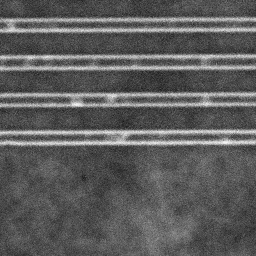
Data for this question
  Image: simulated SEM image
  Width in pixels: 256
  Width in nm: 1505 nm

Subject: parallel lines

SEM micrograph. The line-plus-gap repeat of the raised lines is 221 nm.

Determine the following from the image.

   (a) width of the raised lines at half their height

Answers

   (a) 71.3 nanometers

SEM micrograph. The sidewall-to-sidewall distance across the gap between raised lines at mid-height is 147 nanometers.